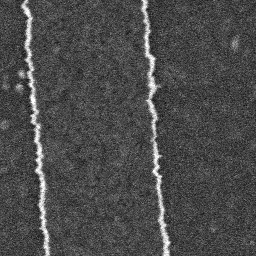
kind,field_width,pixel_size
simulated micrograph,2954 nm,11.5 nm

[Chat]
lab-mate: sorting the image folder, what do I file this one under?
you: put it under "one or a few lines or trenches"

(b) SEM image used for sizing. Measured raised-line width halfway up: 1370 nm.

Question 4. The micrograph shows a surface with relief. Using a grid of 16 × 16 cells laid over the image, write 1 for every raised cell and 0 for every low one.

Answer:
0011111110000000
0011111110000000
0011111110000000
0011111110000000
0011111110000000
0011111111000000
0011111110000000
0011111111000000
0011111111000000
0011111111000000
0011111111000000
0001111111000000
0001111111000000
0001111111000000
0001111111000000
0001111111000000